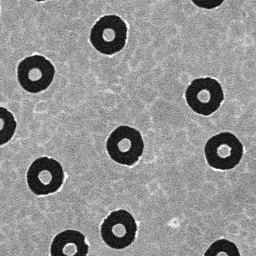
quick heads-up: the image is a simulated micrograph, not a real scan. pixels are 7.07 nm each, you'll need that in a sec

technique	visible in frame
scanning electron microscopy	ring-shaped grooves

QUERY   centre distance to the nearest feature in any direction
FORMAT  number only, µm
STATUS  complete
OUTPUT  0.588